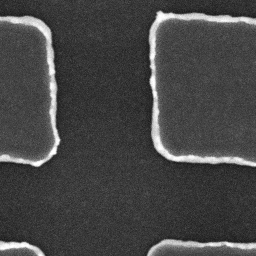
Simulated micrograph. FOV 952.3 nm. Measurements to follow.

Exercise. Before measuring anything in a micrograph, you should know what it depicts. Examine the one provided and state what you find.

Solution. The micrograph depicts raised bodies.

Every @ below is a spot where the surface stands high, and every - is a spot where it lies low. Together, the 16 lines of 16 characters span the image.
----------------
@@@-------@@@@@@
@@@------@@@@@@@
@@@------@@@@@@@
@@@------@@@@@@@
@@@------@@@@@@@
@@@-------@@@@@@
@@@-------@@@@@@
@@@@------@@@@@@
@@@-------@@@@@@
----------------
----------------
----------------
----------------
----------------
@@--------@@@@@@